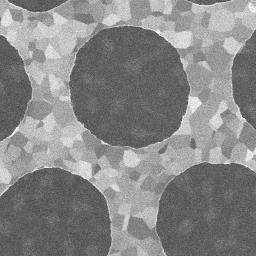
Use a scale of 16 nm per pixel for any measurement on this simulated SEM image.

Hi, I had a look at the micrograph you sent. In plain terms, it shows holes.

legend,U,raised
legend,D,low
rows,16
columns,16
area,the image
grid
UDDUUUUUUUUUUUUU
UUUUUUUUUUUUUUUU
UUUUUUDDDDUUUUUD
DUUUUDDDDDDUUUUD
DDUUDDDDDDDDUUDD
DDUUDDDDDDDDUUDD
DDUUDDDDDDDDUUUD
DUUUUDDDDDDUUUUD
DUUUUUDDDDDUUUUU
UUUUUUUUUUUUUUUU
UUUDUUUUUUUUDDDD
UDDDDDUUUUUDDDDD
DDDDDDDUUUDDDDDD
DDDDDDDUUUDDDDDD
DDDDDDDUUUDDDDDD
DDDDDDDUUUDDDDDD